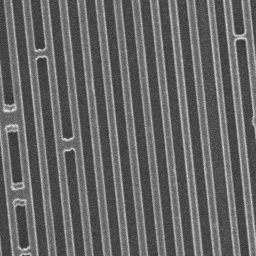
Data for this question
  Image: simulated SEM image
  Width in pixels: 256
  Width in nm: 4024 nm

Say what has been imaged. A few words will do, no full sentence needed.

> parallel lines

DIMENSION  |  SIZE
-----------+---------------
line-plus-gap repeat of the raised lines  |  18.2 pixels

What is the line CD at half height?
121 nm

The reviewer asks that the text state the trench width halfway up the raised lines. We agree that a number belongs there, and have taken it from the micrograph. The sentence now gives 0.16 µm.